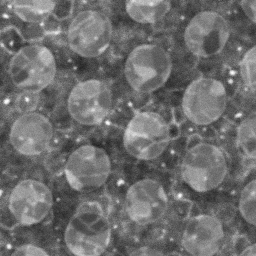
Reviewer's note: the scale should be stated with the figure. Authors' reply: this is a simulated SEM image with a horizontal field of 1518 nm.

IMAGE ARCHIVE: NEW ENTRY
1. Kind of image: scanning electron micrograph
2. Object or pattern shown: a regular array of raised bodies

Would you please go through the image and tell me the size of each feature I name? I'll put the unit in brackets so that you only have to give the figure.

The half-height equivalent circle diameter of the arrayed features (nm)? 265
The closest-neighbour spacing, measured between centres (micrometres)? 0.391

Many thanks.